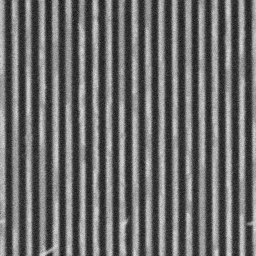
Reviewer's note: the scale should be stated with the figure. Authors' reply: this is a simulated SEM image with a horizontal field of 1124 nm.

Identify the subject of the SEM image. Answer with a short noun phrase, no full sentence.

parallel lines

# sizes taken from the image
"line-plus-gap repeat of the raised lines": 0.0586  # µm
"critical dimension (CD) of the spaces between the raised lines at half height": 34.6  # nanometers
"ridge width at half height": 23.1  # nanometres